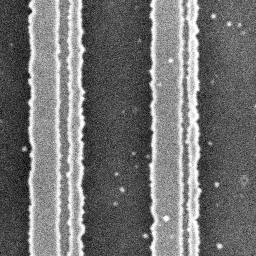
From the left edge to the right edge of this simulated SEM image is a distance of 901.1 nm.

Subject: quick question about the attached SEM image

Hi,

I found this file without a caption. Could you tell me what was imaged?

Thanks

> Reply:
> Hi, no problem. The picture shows lines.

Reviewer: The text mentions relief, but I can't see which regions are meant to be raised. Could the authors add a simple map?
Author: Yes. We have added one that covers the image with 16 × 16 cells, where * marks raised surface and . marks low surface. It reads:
..***....***....
..***.....**....
..***.....**....
..***....***....
..***....***....
..***....***....
..***....***....
..***.....**....
..***.....**....
..***.....**....
..***....***....
..***....***....
..***....***....
..***.....**....
..***.....**....
..***.....**....